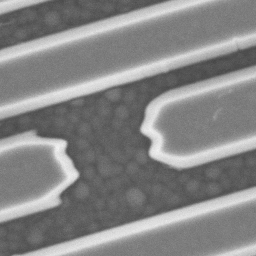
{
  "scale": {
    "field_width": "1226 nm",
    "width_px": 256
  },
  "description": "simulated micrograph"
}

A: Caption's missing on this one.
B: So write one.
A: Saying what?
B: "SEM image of one or a few lines or trenches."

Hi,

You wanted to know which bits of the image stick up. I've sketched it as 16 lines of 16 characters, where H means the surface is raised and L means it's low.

LLLLLLLLLLHHHHHH
LLLLLLLHHHHHHHHH
LLLHHHHHHHHHHHHH
HHHHHHHHHHHHLLLL
HHHHHHHHHLLLLLLL
HHHHHHLLLLLLHHHH
HHLLLLLLLLHHHHHH
LLLLLLLLLHHHHHHH
LLLLLLLLLLHHHHHH
HHHHLLLLLLHHHHLL
HHHHLLLLLLLLLLLL
HHHHLLLLLLLLLLLL
HHHLLLLLLLLLLLHH
LLLLLLLLLLLHHHHH
LLLLLLLLHHHHHHHH
LLLLHHHHHHHHHHHH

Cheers